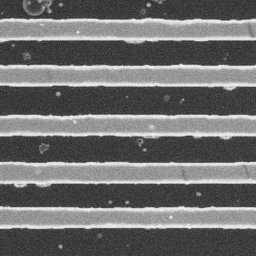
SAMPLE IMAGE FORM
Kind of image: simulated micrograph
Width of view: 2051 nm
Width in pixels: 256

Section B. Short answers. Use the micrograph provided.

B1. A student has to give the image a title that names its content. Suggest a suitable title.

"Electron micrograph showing lines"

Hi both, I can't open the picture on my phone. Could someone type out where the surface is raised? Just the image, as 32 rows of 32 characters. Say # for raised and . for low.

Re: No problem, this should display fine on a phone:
....#...........................
................................
###..#...###......##............
################################
################################
................................
................................
................................
################################
################################
################################
................................
................................
................................
..#.......##.###...#...###...##.
################################
################################
................................
................................
................................
####.############.##############
################################
################################
................................
................................
................................
################################
################################
................................
................................
................................
................................